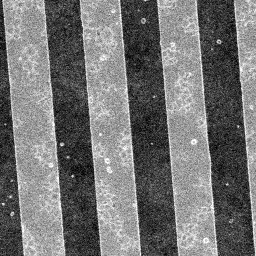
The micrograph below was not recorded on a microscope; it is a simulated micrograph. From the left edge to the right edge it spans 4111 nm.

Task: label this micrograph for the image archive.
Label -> one or a few lines or trenches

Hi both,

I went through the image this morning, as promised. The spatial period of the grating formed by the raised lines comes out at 1.22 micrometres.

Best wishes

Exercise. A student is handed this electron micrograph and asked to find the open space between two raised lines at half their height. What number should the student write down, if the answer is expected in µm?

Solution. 0.604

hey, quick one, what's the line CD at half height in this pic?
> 628 nanometres